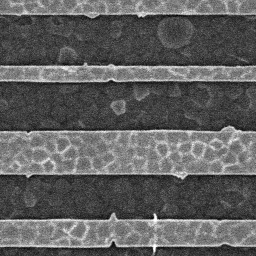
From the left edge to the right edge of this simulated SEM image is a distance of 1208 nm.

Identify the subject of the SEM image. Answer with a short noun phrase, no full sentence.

one or a few lines or trenches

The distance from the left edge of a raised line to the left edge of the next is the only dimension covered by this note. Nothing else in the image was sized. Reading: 79.7 pixels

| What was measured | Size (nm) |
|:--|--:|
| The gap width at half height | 232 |